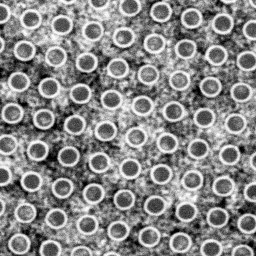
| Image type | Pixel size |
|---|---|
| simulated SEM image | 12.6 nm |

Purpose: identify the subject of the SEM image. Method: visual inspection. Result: a regular array of raised bodies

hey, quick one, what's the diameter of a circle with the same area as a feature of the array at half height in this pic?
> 242 nm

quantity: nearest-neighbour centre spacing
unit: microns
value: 0.397